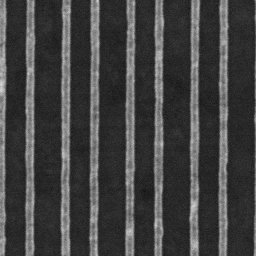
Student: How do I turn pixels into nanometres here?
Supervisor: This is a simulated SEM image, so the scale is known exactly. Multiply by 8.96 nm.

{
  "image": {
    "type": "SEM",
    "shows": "parallel lines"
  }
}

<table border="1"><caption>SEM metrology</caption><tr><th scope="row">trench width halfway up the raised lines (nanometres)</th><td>206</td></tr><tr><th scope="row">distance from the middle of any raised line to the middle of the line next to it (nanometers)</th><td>289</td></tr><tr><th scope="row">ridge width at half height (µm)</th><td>0.0605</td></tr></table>